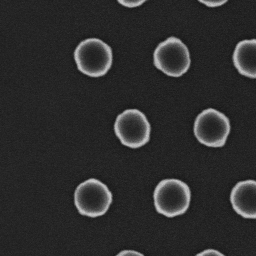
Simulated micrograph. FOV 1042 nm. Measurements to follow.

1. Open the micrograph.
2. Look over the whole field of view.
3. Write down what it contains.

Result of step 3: raised bodies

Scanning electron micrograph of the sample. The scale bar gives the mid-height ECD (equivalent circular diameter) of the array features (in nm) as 143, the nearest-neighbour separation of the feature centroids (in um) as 0.322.